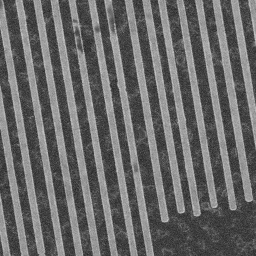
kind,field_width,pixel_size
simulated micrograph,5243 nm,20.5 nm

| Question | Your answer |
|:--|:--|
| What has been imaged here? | parallel lines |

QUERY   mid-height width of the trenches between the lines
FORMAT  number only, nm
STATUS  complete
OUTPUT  230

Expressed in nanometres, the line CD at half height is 134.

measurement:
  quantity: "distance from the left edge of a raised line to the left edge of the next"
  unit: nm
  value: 364